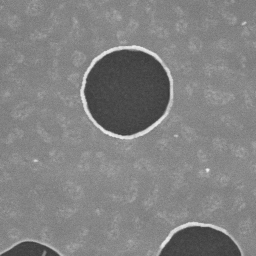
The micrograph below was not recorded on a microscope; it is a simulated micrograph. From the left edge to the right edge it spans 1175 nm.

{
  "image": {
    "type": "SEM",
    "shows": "holes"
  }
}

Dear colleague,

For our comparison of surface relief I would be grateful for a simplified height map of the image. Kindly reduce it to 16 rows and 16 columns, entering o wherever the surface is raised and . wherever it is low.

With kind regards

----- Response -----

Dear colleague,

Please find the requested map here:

oooooooooooooooo
oooooooooooooooo
oooooooooooooooo
ooooooo..ooooooo
oooooo....oooooo
ooooo......ooooo
ooooo.....oooooo
oooooo....oooooo
oooooooooooooooo
oooooooooooooooo
oooooooooooooooo
oooooooooooooooo
oooooooooooooooo
oooooooooooooooo
ooooooooooo...oo
o..ooooooo.....o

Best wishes